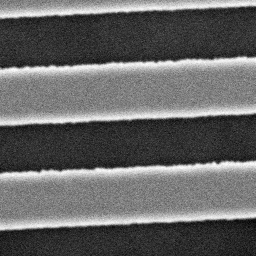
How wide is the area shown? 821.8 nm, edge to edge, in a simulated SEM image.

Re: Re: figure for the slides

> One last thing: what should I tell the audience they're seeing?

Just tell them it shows lines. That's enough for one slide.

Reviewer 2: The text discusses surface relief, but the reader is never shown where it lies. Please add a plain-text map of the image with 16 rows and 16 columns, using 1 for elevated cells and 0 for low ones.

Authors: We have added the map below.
1111111111111000
0000000000000000
0000000000000000
0000000000000000
1111111111111111
1111111111111111
1111111111111111
1111111000000000
0000000000000000
0000000000000000
0000000011111111
1111111111111111
1111111111111111
1111111111111111
0000000000000000
0000000000000000